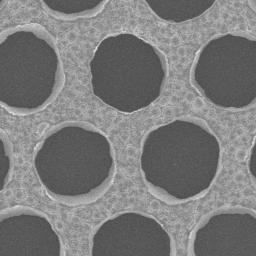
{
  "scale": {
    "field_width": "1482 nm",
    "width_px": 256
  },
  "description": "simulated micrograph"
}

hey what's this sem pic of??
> holes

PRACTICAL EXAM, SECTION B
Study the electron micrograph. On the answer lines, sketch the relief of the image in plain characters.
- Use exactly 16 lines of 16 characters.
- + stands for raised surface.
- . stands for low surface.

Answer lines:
+++...+++....+++
++++++++++++++++
...++++..++++...
....++....++....
....++....++....
....++....++....
...++++..++++...
++++++++++++++++
+++...+++....+++
.+.....++.....++
.+.....++.....++
+++....++....+++
++++++++++++++++
...++++..++++...
...+++....++....
....++.....+....